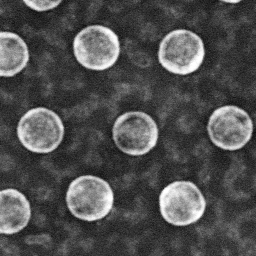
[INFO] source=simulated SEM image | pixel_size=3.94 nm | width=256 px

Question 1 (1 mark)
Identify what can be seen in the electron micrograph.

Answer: raised bodies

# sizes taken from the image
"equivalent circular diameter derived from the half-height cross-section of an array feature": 168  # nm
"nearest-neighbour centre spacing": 0.332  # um